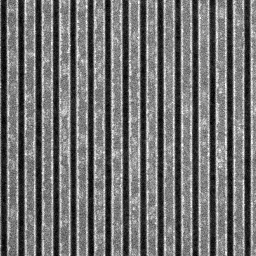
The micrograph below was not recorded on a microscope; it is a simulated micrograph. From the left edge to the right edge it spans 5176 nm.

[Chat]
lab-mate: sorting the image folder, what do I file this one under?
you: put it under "parallel lines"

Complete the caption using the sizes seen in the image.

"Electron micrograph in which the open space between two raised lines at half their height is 0.137 um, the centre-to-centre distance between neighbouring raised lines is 0.352 microns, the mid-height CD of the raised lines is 215 nm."